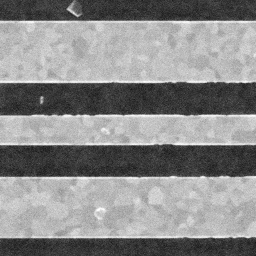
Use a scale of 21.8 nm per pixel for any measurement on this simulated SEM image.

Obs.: lines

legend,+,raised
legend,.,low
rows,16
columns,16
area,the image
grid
................
++++++++++++++++
++++++++++++++++
++++++++++++++++
++++++++++++++++
................
................
++++++++++++++++
++++++++++++++++
................
................
++++++++++++++++
++++++++++++++++
++++++++++++++++
++++++++++++++++
................